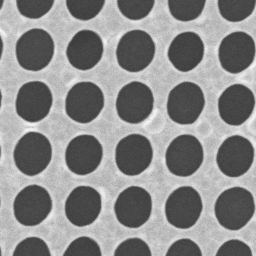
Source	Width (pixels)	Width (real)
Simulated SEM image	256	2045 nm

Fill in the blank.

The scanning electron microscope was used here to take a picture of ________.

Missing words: a regular array of holes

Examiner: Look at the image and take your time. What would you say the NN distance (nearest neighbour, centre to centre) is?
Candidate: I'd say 0.403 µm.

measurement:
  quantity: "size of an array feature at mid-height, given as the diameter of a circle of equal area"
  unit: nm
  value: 319